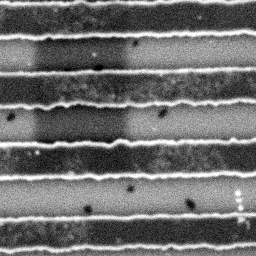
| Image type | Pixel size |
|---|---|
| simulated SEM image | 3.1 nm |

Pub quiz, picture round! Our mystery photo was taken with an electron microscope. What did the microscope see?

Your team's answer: lines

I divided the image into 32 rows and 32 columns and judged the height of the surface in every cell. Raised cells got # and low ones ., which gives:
################################
################################
################################
################################
###########..#.#................
................................
................................
................................
................................
################################
################################
################################
################################
...#.#..........................
................................
................................
................................
.............................#.#
################################
################################
################################
################################
................................
................................
................................
................................
................................
################################
################################
################################
################################
.#..............................